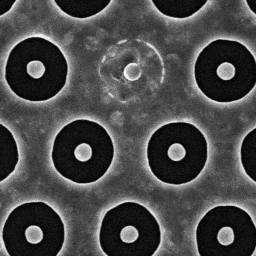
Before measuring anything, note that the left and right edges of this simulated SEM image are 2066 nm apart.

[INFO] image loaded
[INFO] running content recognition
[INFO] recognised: ring-shaped grooves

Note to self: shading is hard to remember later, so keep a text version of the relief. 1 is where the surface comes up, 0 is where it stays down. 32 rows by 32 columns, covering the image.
00111110000000111110000000111110
01111111000011111111000011111111
11111111111111111111111111111111
11111111111111111111111111111111
11111111111111111111111111111111
11000001111111111111111111000011
10000000111111111111111110000001
10000000111111111111111110000000
10011000111111111111111100011000
10001000111111111111111100011000
10000000111111111111111110000000
11000001111111111111111110000001
11100011111111111111111111100011
11111111111111111111111111111111
11111111111111111111111111111111
11111111100011111111100011111111
01111110000001111110000001111110
00111110000000111110000000111100
00111110001000111100011000111100
00111100011000111100011000111100
00111110000000111110000000111100
00111110000001111110000001111110
11111111100011111111000011111111
11111111111111111111111111111111
11111111111111111111111111111111
11100011111111100111111111111111
10000001111110000001111111000001
10000000111110000001111110000001
00001000111110001000111110001000
00011000111100011000111110011000
10000000111110000000111110001000
10000001111110000001111110000000